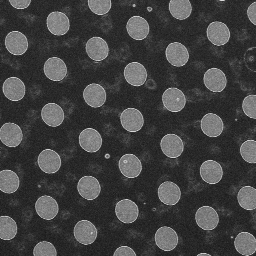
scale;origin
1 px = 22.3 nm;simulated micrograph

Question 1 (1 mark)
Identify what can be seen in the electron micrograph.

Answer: a regular array of raised bodies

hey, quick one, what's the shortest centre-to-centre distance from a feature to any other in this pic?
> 1020 nm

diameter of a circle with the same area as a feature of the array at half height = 514 nm